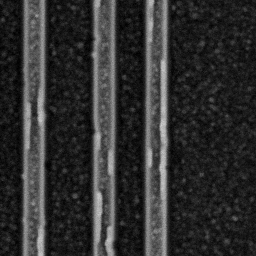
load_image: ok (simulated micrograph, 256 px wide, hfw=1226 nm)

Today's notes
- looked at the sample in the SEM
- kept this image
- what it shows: parallel lines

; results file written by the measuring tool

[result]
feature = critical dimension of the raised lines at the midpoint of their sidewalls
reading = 86.8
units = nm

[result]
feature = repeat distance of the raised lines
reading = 293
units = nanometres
